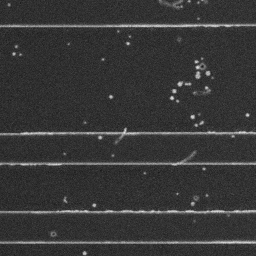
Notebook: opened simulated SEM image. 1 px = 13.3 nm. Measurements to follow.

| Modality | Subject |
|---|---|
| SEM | lines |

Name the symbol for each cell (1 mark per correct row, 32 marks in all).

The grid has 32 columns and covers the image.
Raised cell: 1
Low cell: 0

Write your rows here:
11111111111111111111111111111111
11111111111111111111111111111111
11111111111111111111111111111111
00000000000000000000000000000000
00000000000000000000000000000000
00000000000000000000000000000000
00000000000000000000000000000000
00000000000000000000000000000000
00000000000000000000000000000000
00000000000000000000000000000000
00000000000000000000000000000000
00000000000000000000000000000000
00000000000000000000000000000000
00000000000000000000000000000000
00000000000000000000000000000000
00000000000000000000000000000000
00000000000000010000000000000000
11111111111111111111111111111111
11111111111111111111111111111111
11111111111111111111111111111111
00000000000000000000010000000000
00000000000000000000000000000000
00000000000000000000000000000000
00000000000000000000000000000000
00000000000000000000000000000000
00000000000000000000000000000000
11111111111111111111111111111111
11111111111111111111111111111111
11111111111111111111111111111111
11111111111111111111111111111111
00000000000000000000000000000000
00000000000000000000000000000000